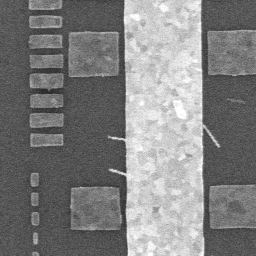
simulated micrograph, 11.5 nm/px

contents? wiring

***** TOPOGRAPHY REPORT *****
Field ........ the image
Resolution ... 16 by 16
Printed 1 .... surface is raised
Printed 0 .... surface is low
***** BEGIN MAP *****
0010000011111000
0011000011111000
0011111111111111
0010111111111111
0011111011111111
0011000011111000
0011000011111000
0011000011111000
0011000011111000
0000000011111000
0000000011111000
0000000011111000
0000111111111111
0000111111111111
0000000011111000
0000000011111000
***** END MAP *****